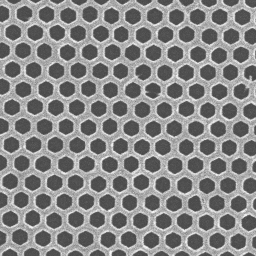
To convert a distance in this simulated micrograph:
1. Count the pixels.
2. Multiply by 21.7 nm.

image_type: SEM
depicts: a regular array of holes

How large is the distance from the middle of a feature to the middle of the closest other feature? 452 nm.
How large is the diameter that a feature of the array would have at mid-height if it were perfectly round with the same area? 351 nm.